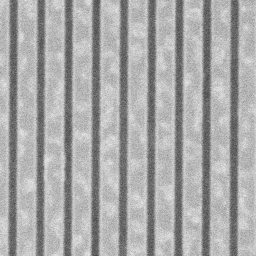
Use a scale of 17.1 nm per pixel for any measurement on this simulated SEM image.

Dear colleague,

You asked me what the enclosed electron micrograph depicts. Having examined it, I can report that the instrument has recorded parallel lines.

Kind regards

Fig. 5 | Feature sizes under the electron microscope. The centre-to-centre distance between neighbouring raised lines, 471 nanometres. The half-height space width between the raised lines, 171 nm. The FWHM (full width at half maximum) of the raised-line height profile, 301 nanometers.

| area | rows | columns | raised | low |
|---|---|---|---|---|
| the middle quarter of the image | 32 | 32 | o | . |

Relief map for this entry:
...oooo..ooooo..ooooo..oooo...oo
...oooo..ooooo..ooooo..oooo...oo
...oooo..ooooo..ooooo..oooo...oo
...oooo..ooooo..ooooo..oooo...oo
...oooo..ooooo..ooooo..oooo...oo
...oooo..ooooo..ooooo..oooo...oo
...oooo..ooooo..ooooo..oooo...oo
...oooo..ooooo..ooooo..oooo...oo
...oooo..ooooo..ooooo..oooo...oo
...oooo..ooooo..ooooo..oooo...oo
...oooo..ooooo..ooooo..oooo...oo
..ooooo..ooooo..ooooo..oooo...oo
..ooooo..ooooo..ooooo..oooo...oo
..ooooo..ooooo..oooo...oooo...oo
..ooooo..ooooo..oooo...oooo...oo
..ooooo..ooooo..oooo...oooo...oo
..ooooo..ooooo..oooo...oooo...oo
..ooooo..ooooo..oooo...oooo...oo
..ooooo..ooooo..oooo...oooo...oo
..ooooo..ooooo..oooo...oooo...oo
..ooooo..ooooo..oooo...oooo...oo
..ooooo..ooooo..oooo...oooo...oo
..ooooo..ooooo..oooo...oooo...oo
..ooooo..ooooo..oooo...oooo...oo
..ooooo..ooooo..oooo...oooo...oo
..ooooo..ooooo..oooo...oooo...oo
..ooooo..ooooo..oooo...oooo...oo
..ooooo..ooooo..oooo...oooo...oo
..ooooo..oooo...oooo...oooo...oo
..ooooo..oooo...oooo...oooo...oo
..ooooo..oooo...oooo...oooo...oo
..ooooo..oooo...oooo...oooo...oo